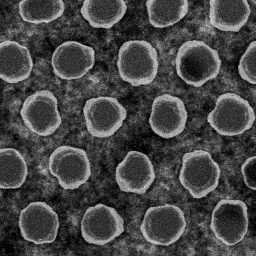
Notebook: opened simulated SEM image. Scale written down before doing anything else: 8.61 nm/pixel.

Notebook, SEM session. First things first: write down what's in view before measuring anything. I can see a regular array of raised bodies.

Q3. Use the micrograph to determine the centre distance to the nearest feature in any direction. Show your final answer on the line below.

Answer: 521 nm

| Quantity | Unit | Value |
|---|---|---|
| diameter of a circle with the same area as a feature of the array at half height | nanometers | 341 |